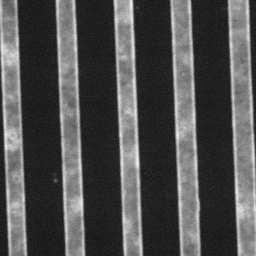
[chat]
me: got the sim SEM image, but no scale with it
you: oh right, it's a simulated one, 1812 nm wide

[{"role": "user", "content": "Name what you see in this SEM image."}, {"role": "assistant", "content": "parallel lines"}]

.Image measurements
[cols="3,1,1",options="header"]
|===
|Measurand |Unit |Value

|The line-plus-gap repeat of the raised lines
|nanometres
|407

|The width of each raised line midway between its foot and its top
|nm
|126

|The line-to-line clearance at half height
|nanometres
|278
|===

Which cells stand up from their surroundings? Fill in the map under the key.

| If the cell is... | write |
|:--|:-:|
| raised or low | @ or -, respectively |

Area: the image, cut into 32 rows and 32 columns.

@@-----@@-----@@-----@@@-----@@-
@@-----@@-----@@-----@@@-----@@-
@@-----@@------@@-----@@-----@@-
@@-----@@-----@@@-----@@-----@@-
@@-----@@------@@-----@@-----@@-
@@-----@@@-----@@-----@@-----@@-
@@-----@@@-----@@-----@@-----@@-
@@-----@@@-----@@-----@@-----@@-
@@-----@@@-----@@-----@@-----@@-
@@-----@@@-----@@-----@@-----@@-
@@-----@@@-----@@-----@@-----@@-
@@------@@-----@@-----@@-----@@-
@@------@@-----@@-----@@-----@@-
@@@-----@@-----@@-----@@-----@@-
-@@-----@@-----@@-----@@-----@@-
-@@-----@@-----@@-----@@-----@@@
-@@-----@@-----@@-----@@-----@@@
-@@-----@@-----@@-----@@-----@@@
-@@-----@@-----@@-----@@-----@@@
-@@-----@@-----@@-----@@-----@@@
-@@-----@@-----@@-----@@-----@@@
-@@-----@@-----@@-----@@@----@@@
-@@-----@@-----@@-----@@@----@@@
-@@-----@@-----@@-----@@@----@@@
-@@-----@@-----@@-----@@@-----@@
-@@-----@@-----@@-----@@@-----@@
-@@-----@@-----@@-----@@@-----@@
-@@-----@@-----@@@-----@@-----@@
-@@-----@@-----@@@-----@@-----@@
-@@-----@@------@@-----@@-----@@
-@@-----@@------@@-----@@-----@@
-@@-----@@------@@-----@@-----@@